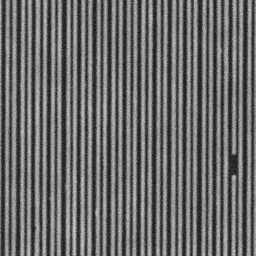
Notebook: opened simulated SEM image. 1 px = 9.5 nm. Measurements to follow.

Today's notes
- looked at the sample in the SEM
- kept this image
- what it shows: parallel lines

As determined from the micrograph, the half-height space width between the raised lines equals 35.6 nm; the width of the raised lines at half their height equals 34.4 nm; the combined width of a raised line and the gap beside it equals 71.8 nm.